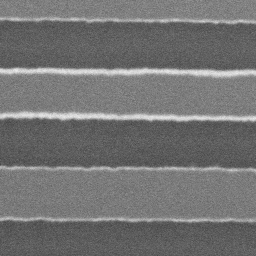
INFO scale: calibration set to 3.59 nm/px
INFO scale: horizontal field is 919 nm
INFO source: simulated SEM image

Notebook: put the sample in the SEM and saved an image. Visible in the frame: lines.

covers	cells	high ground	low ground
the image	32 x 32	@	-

@@@@@@@@@@@@@@@@@@@@@@@@@@@@@@@@
@@@@@@@@@@@@@@@@@@@@@@@@@@@@@@@@
----@-----@@@@@@@@@@@@@@@@@@@@@@
--------------------------------
--------------------------------
--------------------------------
--------------------------------
--------------------------------
--------------------------------
@@@@@@@@@@@@@@@@@@@@@@@@@@@@@@@@
@@@@@@@@@@@@@@@@@@@@@@@@@@@@@@@@
@@@@@@@@@@@@@@@@@@@@@@@@@@@@@@@@
@@@@@@@@@@@@@@@@@@@@@@@@@@@@@@@@
@@@@@@@@@@@@@@@@@@@@@@@@@@@@@@@@
@@@@@@@@@@@@@@@@@@@@@@@@@@@@@@@@
--------------------------------
--------------------------------
--------------------------------
--------------------------------
--------------------------------
--------------------------------
@@@@@@@@@@@@@@@@@@@@@@@@@@@@@@@@
@@@@@@@@@@@@@@@@@@@@@@@@@@@@@@@@
@@@@@@@@@@@@@@@@@@@@@@@@@@@@@@@@
@@@@@@@@@@@@@@@@@@@@@@@@@@@@@@@@
@@@@@@@@@@@@@@@@@@@@@@@@@@@@@@@@
@@@@@@@@@@@@@@@@@@@@@@@@@@@@@@@@
---@---@@--@----@@@--@@@@@@@@@@@
--------------------------------
--------------------------------
--------------------------------
--------------------------------